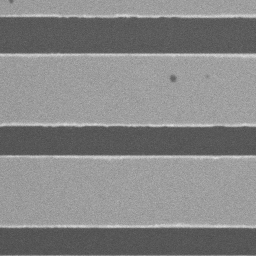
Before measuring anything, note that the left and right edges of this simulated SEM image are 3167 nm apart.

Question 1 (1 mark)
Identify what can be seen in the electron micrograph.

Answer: lines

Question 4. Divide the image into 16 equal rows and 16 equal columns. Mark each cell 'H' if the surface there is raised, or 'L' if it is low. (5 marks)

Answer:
HHHHHHHHHHHHHHHH
LLLLLLLLLLLLLLLL
LLLLLLLLLLLLLLLL
HHHHHHHHHHHHHHHH
HHHHHHHHHHHHHHHH
HHHHHHHHHHHHHHHH
HHHHHHHHHHHHHHHH
HHHHHHHHHHHHHHHH
LLLLLLLLLLLLLLLL
LLLLLLLLLLLLLLLL
HHHHHHHHHHHHHHHH
HHHHHHHHHHHHHHHH
HHHHHHHHHHHHHHHH
HHHHHHHHHHHHHHHH
LLLLLLLLLLLLLLLL
LLLLLLLLLLLLLLLL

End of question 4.